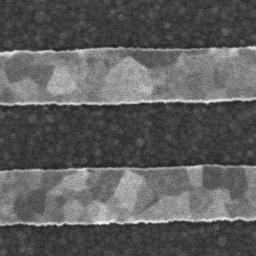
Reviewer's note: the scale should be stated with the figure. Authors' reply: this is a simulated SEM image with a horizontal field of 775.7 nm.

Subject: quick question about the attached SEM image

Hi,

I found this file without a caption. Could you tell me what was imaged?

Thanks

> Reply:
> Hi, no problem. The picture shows one or a few lines or trenches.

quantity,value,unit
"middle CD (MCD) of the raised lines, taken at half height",53.4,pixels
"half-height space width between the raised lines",198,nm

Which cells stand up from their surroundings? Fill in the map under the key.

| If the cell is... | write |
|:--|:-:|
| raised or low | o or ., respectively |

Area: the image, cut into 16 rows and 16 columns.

................
................
................
oooooooooooooooo
oooooooooooooooo
oooooooooooooooo
oo..............
................
................
................
..........oooooo
oooooooooooooooo
oooooooooooooooo
oooooooooooooooo
................
................